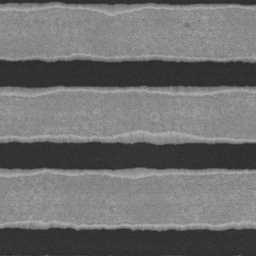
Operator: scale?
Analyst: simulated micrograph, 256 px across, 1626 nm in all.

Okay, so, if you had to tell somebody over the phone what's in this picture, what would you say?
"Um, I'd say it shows lines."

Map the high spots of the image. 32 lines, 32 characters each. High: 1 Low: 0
00000000000000000000000000000000
11111111111111111111111111111111
11111111111111111111111111111111
11111111111111111111111111111111
11111111111111111111111111111111
11111111111111111111111111111111
11111111111111111111111111111111
00000000000000000000000000011000
00000000000000000000000000000000
00000000000000000000000000000000
00000000000000000000000000000000
11100111111111111111111111111111
11111111111111111111111111111111
11111111111111111111111111111111
11111111111111111111111111111111
11111111111111111111111111111111
11111111111111111111111111111111
00000000000000000000000001111111
00000000000000000000000000000000
00000000000000000000000000000000
00000000000000000000000000000000
00001110000000000000000000111111
11111111111111111111111111111111
11111111111111111111111111111111
11111111111111111111111111111111
11111111111111111111111111111111
11111111111111111111111111111111
11111111111111111111111111111111
00000000000001001001101000100000
00000000000000000000000000000000
00000000000000000000000000000000
00000000000000000000000000000000